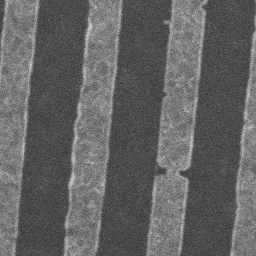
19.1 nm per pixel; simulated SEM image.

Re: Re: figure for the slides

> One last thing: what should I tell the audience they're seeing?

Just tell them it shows one or a few lines or trenches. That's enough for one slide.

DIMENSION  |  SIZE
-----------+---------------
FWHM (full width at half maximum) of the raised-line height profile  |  592 nanometers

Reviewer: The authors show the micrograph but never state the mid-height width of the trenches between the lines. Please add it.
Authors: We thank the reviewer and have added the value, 0.989 micrometres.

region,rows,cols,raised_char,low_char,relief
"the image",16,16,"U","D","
UUDDDDUUDDDUUDDD
UUDDDDUDDDDUUDDD
UUDDDUUDDDDUUDDD
UUDDDUUDDDDUDDDD
UUDDDUUDDDUUDDDD
UUDDDUUDDDUUDDDD
UUDDDUUDDDUUDDDU
UUDDDUUDDDUUDDDU
UUDDDUUDDDUUDDDU
UDDDDUUDDDUUDDDU
UDDDDUUDDDUUDDDU
UDDDUUUDDDUUDDDU
UDDDUUDDDDUUDDDU
UDDDUUDDDUUDDDDU
UDDDUUDDDUUDDDDU
UDDDUUDDDUUDDDDU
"